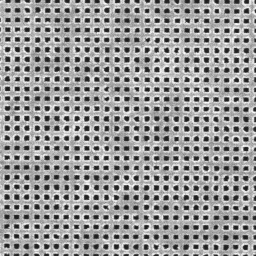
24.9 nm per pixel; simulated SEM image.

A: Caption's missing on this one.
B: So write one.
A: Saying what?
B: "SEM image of a regular array of holes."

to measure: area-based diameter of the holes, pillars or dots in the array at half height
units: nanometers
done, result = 154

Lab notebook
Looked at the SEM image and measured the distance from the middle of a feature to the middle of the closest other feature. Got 237 nm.